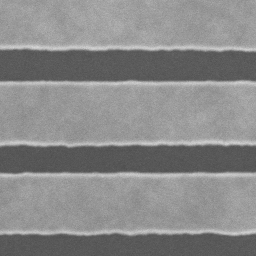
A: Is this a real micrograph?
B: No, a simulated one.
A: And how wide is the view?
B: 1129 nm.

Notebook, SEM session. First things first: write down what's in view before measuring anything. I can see lines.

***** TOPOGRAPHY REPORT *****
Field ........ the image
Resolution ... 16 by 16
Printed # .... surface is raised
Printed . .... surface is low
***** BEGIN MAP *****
################
################
################
................
................
################
################
################
################
................
................
################
################
################
################
................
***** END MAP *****